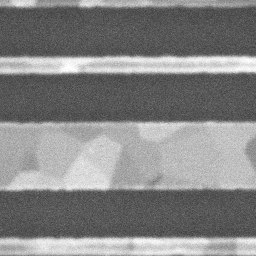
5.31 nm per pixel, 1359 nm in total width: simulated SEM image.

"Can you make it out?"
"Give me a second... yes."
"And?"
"lines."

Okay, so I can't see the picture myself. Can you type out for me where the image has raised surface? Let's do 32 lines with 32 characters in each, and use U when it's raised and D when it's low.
UUUUUUUUUUUUUUUUUUUUUUUUUUUUUUUU
DDDDDDDDDDDDDDDDDDDDDDDDDDDDDDDD
DDDDDDDDDDDDDDDDDDDDDDDDDDDDDDDD
DDDDDDDDDDDDDDDDDDDDDDDDDDDDDDDD
DDDDDDDDDDDDDDDDDDDDDDDDDDDDDDDD
DDDDDDDDDDDDDDDDDDDDDDDDDDDDDDDD
DDDDDDDDDDDDDDDDDDDDDDDDDDDDDDDD
UUUUUUUUUUUUUUUUUUUUUUUUUUUUUUUU
UUUUUUUUUUUUUUUUUUUUUUUUUUUUUUUU
DDDDDDDDDDDDDDDDDDDDDDDDDDDDDDDD
DDDDDDDDDDDDDDDDDDDDDDDDDDDDDDDD
DDDDDDDDDDDDDDDDDDDDDDDDDDDDDDDD
DDDDDDDDDDDDDDDDDDDDDDDDDDDDDDDD
DDDDDDDDDDDDDDDDDDDDDDDDDDDDDDDD
DDDDDDDDDDDDDDDDDDDDDDDDDDDDDDDD
UUUDUUUUUUUUUUUUUUUUUUUUUUUUUUUU
UUUUUUUUUUUUUUUUUUUUUUUUUUUUUUUU
UUUUUUUUUUUUUUUUUUUUUUUUUUUUUUUU
UUUUUUUUUUUUUUUUUUUUUUUUUUUUUUUU
UUUUUUUUUUUUUUUUUUUUUUUUUUUUUUUU
UUUUUUUUUUUUUUUUUUUUUUUUUUUUUUUU
UUUUUUUUUUUUUUUUUUUUUUUUUUUUUUUU
UUUUUUUUUUUUUUUUUUUUUUUUUUUUUUUU
UUUUUUUUUUUUUUUUUUUUUUUUUUUUUUUU
DDDDDDDDDDDDDDDDDDDDDDDDDDDDDDDD
DDDDDDDDDDDDDDDDDDDDDDDDDDDDDDDD
DDDDDDDDDDDDDDDDDDDDDDDDDDDDDDDD
DDDDDDDDDDDDDDDDDDDDDDDDDDDDDDDD
DDDDDDDDDDDDDDDDDDDDDDDDDDDDDDDD
DDDDDDDDDDDDDDDDDDDDDDDDDDDDDDDD
UUUUUUUUUUUUUUUUUUUUUUUUUUUUUUUU
UUUUUUUUUUUUUUUUUUUUUUUUUUUUUUUU